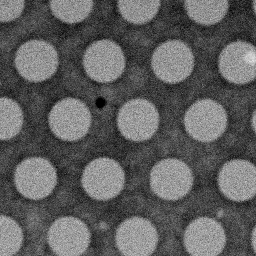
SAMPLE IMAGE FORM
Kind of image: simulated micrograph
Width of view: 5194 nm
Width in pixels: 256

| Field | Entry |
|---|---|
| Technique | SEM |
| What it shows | an array of small figures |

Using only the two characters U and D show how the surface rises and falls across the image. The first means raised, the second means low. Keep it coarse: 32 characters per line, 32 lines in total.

UUUDDDUUUUUUDDDUUUUUDDDUUUUUDDDD
UUUDDDDUUUUDDDDUUUUUDDDUUUUUDDDD
UDDDDDDDUUDDDDDDUUUDDDDDUUUUDDDD
DDDDDDDDDDDDDDDDDDDDDDDDDDDDDDDD
DDDDDDDDDDDDDDDDDDDDDDDDDDDDDDDD
DDDUUUDDDDDDUUDDDDDDUUUDDDDDDUUD
DDUUUUUDDDDUUUUDDDDUUUUUDDDDUUUU
DDUUUUUDDDUUUUUUDDDUUUUUDDDUUUUU
DDUUUUUDDDDUUUUDDDDUUUUUDDDUUUUU
DDDUUUDDDDDUUUUDDDDDUUUDDDDDUUUU
DDDDDDDDDDDDDDDDDDDDDDDDDDDDDDDD
DDDDDDDDDDDDDDDDDDDDDDDDDDDDDDDD
UDDDDDDDUUDDDDDDDUDDDDDDDUDDDDDD
UUDDDDDUUUUDDDDUUUUDDDDDUUUUDDDD
UUUDDDUUUUUDDDDUUUUUDDDUUUUUDDDD
UUUDDDUUUUUDDDDUUUUUDDDUUUUUDDDD
UUDDDDDUUUUDDDDUUUUDDDDDUUUUDDDD
DDDDDDDDUDDDDDDDUUDDDDDDDUUDDDDD
DDDDDDDDDDDDDDDDDDDDDDDDDDDDDDDD
DDDDDDDDDDDDDDDDDDDDDDDDDDDDDDDD
DDDUUUDDDDDUUUUDDDDDUUUDDDDDUUUD
DDUUUUUDDDDUUUUDDDDUUUUUDDDDUUUU
DDUUUUUDDDUUUUUUDDDUUUUUDDDUUUUU
DDUUUUUDDDDUUUUDDDDUUUUUDDDUUUUU
DDDUUUDDDDDUUUDDDDDDUUUDDDDDUUUU
DDDDDDDDDDDDDDDDDDDDDDDDDDDDDDDD
DDDDDDDDDDDDDDDDDDDDDDDDDDDDDDDD
UUDDDDDUUUDDDDDDUUDDDDDDDUUDDDDD
UUDDDDUUUUUDDDDUUUUDDDDUUUUUDDDD
UUUDDDUUUUUDDDDUUUUUDDDUUUUUDDDD
UUUDDDUUUUUDDDDUUUUUDDDUUUUUDDDD
UUDDDDDUUUDDDDDUUUUDDDDDUUUUDDDD